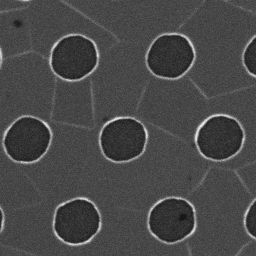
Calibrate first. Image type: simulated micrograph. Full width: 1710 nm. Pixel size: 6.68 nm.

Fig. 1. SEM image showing holes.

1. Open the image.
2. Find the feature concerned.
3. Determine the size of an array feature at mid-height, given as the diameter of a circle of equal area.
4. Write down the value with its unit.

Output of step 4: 303 nm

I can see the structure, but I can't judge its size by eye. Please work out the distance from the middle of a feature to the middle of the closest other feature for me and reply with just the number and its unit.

632 nanometres